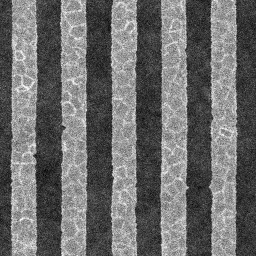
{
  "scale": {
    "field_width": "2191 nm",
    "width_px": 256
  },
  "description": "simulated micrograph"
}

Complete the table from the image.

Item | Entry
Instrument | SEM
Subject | parallel lines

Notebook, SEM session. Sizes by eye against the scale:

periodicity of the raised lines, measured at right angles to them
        0.427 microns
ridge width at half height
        203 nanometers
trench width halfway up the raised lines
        220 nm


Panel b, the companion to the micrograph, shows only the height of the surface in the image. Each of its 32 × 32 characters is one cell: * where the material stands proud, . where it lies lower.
..**....***...***...***...***...
..**....***...***...***...***...
..**....***...***...***...***...
..**....***...***...***...***...
..***...***...***...***...***...
..***...***...***...***...***...
..***...***...***...***...***...
..**....***...***...***...***...
..***...***...***...***...***...
..***...***...***...***...***...
..***...***...***...***...***...
..***...***...***...***...***...
..**....***...***...***...***...
..**....***...***...***....**...
..**....***...***...***....**...
.***....***...***...***...***...
..**....***...***...***...****..
..**....***...***...***...***...
..**....***...***...***...***...
.***....***...***...***...***...
.***....***...***...***...***...
.***....***...***...***....**...
.***....***...***...***...***...
.***....***...***...***...***...
.***....***...***...***....**...
.****...***...***...***....**...
.***....***...***...***...***...
.****...***...***...***...***...
.****...***...***...***....**...
.****...***...***...***...***...
..***...***...***...***...***...
..***...***...***...***....**...